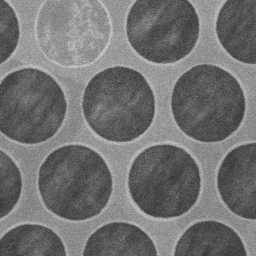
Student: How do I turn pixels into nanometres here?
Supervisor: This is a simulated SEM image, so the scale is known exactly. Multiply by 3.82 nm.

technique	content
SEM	holes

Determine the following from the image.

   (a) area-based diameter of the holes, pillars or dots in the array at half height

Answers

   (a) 291 nanometers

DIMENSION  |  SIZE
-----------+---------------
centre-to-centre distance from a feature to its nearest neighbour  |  340 nm